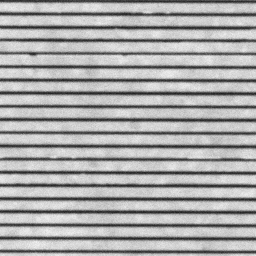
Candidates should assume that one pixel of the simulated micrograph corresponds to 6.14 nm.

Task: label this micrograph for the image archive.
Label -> parallel lines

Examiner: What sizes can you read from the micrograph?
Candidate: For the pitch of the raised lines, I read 81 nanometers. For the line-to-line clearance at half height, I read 20.7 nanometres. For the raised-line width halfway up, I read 57.6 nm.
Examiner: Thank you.